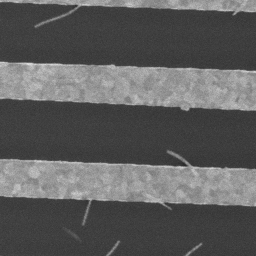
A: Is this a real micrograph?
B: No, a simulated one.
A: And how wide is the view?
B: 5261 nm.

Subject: lines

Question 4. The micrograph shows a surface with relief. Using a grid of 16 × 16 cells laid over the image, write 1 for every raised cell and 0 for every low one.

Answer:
0000000000111111
0000000000000000
0000000000000000
0000000000000000
1111111111111111
1111111111111111
0000000011111111
0000000000000000
0000000000000000
0000000000000000
1111111111111000
1111111111111111
0000010111111111
0000000000000000
0000000000000000
0000000000000000